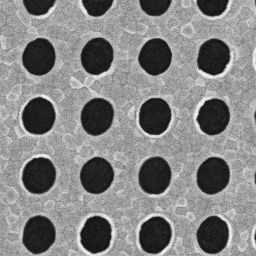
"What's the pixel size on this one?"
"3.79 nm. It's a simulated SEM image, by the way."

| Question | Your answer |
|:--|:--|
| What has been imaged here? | a regular array of holes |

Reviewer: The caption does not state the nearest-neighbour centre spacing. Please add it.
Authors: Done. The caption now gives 220 nm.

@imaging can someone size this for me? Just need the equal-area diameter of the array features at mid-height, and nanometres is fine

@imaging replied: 131